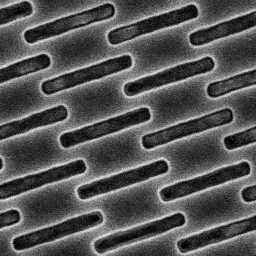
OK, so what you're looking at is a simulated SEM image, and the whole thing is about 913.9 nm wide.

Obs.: a regular array of holes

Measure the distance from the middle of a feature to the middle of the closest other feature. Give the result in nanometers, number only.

196